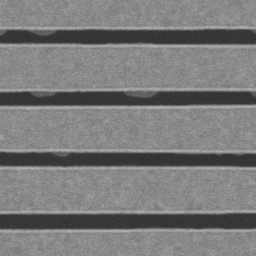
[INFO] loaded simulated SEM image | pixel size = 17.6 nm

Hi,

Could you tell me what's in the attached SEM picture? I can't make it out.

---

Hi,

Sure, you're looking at lines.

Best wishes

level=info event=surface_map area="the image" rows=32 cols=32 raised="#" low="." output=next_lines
################################
################################
################################
################################
................................
................................
################################
################################
################################
################################
################################
................................
................................
################################
################################
################################
################################
################################
################################
................................
................................
################################
################################
################################
################################
################################
################################
................................
................................
################################
################################
################################